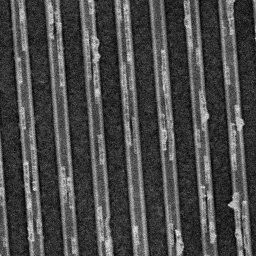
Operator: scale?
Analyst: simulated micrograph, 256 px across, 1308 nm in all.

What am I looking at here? parallel lines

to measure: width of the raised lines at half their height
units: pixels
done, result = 12.6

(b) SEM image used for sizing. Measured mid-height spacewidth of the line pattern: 112 nm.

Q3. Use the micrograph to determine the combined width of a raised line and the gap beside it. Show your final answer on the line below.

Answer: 34.5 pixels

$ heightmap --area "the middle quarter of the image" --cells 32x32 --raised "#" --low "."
......##......###......###.....#
......##......###......###......
......##......###......###......
......###.....###......###......
......###.....###......###......
......###......###.....###......
......###......###.....###......
......###......###.....###......
......###......###.....###......
......###......###.....###......
......###......###......###.....
#.....###......###......###.....
#.....###......###......###.....
#......##......###......###.....
#......##......###......###.....
#......##......###......###.....
#......###.....###......###.....
#......###.....###......###.....
#......###......###.....###.....
#......###......###.....###.....
#......###......###.....###.....
#......###......###.....###.....
#......###......###.....###.....
#......###......###......###....
##.....###......###......###....
##.....###......###......###....
##......##......###......###....
##......##......###......###....
##......##......###......###....
##......###.....###......###....
##......###.....###......###....
##......###......###.....###....